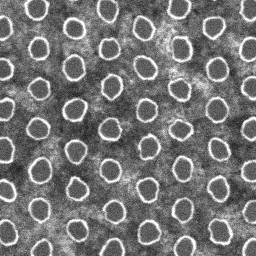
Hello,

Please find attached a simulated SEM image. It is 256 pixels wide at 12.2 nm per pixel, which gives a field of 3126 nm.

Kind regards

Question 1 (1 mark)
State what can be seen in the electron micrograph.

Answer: a regular array of raised bodies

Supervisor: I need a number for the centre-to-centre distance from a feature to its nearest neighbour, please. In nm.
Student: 478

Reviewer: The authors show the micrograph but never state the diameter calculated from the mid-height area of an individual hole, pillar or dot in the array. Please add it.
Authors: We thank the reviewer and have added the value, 270 nanometres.